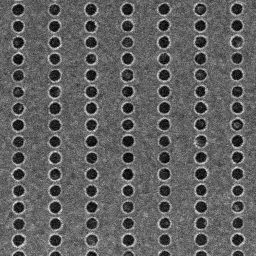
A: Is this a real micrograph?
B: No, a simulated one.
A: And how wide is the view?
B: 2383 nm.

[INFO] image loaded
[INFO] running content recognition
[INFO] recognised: a regular array of holes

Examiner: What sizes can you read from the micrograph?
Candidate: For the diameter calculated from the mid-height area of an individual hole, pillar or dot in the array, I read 110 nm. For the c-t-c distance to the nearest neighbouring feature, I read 152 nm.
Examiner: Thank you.